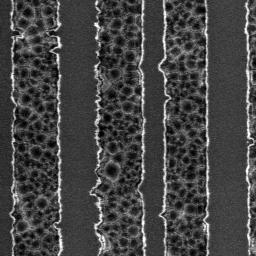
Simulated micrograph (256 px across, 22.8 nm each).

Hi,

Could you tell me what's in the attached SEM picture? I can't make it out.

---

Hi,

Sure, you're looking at one or a few lines or trenches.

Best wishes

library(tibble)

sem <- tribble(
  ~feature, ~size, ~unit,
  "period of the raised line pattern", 1710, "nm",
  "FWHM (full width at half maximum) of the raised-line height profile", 1000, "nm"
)